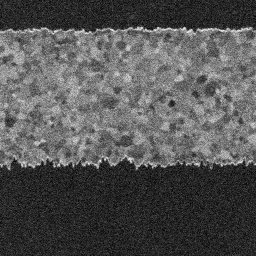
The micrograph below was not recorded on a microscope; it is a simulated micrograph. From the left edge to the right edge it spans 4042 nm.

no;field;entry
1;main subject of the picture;one or a few lines or trenches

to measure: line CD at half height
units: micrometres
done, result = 2.1